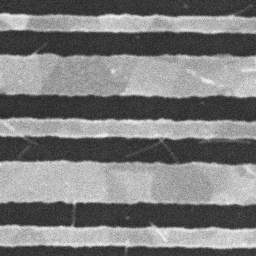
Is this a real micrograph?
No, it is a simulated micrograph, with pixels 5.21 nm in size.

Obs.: lines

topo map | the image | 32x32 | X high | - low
--------------------------------
--------------------------------
XXXXXXXXXXXXXXXXXXXXXXXXXXXXXXXX
XXXXXXXXXXXXXXXXXXXXXXXXXXXXXXXX
--------------------------------
--------------------------------
--------------------------------
XXXXXXXXXXXXXXXXXXXXXXXXXXXXXXXX
XXXXXXXXXXXXXXXXXXXXXXXXXXXXXXXX
XXXXXXXXXXXXXXXXXXXXXXXXXXXXXXXX
XXXXXXXXXXXXXXXXXXXXXXXXXXXXXXXX
XXXXXXXXXXXXXXXXXXXXXXXXXXXXXXXX
--------------------------------
--------------------------------
--------------------------------
XXXXXXXXXXXXXXXXXXXXXXXXXXXXXXXX
XXXXXXXXXXXXXXXXXXXXXXXXXXXXXXXX
--------------------------------
--------------------------------
--------------------------------
XXXXXXXXXXXXXXXXXXXX---XXXX-----
XXXXXXXXXXXXXXXXXXXXXXXXXXXXXXXX
XXXXXXXXXXXXXXXXXXXXXXXXXXXXXXXX
XXXXXXXXXXXXXXXXXXXXXXXXXXXXXXXX
XXXXXXXXXXXXXXXXXXXXXXXXXXXXXXXX
------------------------X--XX-XX
--------------------------------
--------------------------------
XXXXXXXXXXXXXXX---XX------X-----
XXXXXXXXXXXXXXXXXXXXXXXXXXXXXXXX
XXXXXXXXXXXXXXXXXXXXXXXXXXXXXXXX
--------------------------------